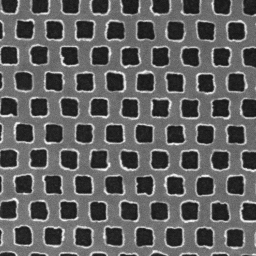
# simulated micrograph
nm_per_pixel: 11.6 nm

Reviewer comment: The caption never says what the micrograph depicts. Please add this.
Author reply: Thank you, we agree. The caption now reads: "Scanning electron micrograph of a regular array of holes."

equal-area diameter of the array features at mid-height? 224 nanometers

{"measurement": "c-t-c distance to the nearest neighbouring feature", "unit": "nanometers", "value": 341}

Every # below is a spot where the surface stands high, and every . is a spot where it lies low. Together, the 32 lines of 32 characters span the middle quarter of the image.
#######################..#######
################################
###....####...#####...####..####
###....###.....###.....###....##
###....####....###.....###....##
###....###.....###.....###....##
###....####....###....####....##
################################
...#############################
...####....####....###....###...
....###....###.....###....###...
....###....###.....###....###...
....###....###.....###....###...
#################.#############.
################################
###....####...####....####....##
###....###.....###....###.....##
###....###.....###....####....##
###....###.....###....####....##
###....####....###....####....##
################################
..#######.#############.########
....###....###....####....###...
....##.....###.....###....###...
....##.....###.....###....###...
....###....####....###....###...
##.#############################
################################
###....###.....###....####....##
###....###.....###....####....##
###....###.....###....####....##
###....###.....###....####....##